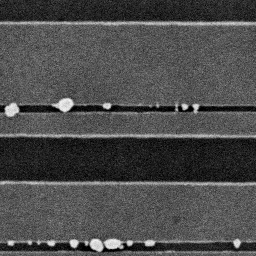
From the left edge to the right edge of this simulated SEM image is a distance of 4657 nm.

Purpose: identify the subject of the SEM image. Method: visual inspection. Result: lines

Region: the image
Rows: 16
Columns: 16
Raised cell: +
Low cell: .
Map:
................
++++++++++++++++
++++++++++++++++
++++++++++++++++
++++++++++++++++
++++++++++++++++
++++++++++++++++
++++++++++++++++
................
................
................
++++.++.+.......
++++++++++++++++
++++++++++++++++
++++++++++++++++
++++++++++++++++